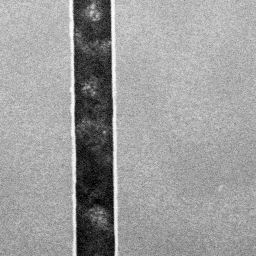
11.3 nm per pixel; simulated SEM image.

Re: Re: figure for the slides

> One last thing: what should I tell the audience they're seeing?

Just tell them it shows one or a few lines or trenches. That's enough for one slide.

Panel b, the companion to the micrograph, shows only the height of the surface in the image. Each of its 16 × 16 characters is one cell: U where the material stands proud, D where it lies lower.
UUUUDDDUUUUUUUUU
UUUUDDDUUUUUUUUU
UUUUUDDUUUUUUUUU
UUUUUDDUUUUUUUUU
UUUUUDDUUUUUUUUU
UUUUUDDUUUUUUUUU
UUUUUDDUUUUUUUUU
UUUUUDDUUUUUUUUU
UUUUUDDUUUUUUUUU
UUUUUDDUUUUUUUUU
UUUUUDDUUUUUUUUU
UUUUUDDUUUUUUUUU
UUUUUDDUUUUUUUUU
UUUUUDDUUUUUUUUU
UUUUUDDUUUUUUUUU
UUUUUDDUUUUUUUUU